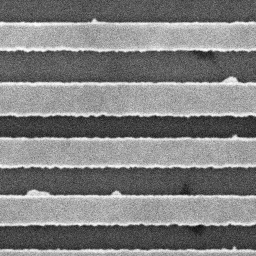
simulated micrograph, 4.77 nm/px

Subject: lines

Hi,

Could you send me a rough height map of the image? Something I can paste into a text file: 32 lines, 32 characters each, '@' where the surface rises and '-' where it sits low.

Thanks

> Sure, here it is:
--------------------------------
--------------------------------
--------------------------------
@@@@@@@@@@@@@@@@@@@@@@@@@@@@@@@@
@@@@@@@@@@@@@@@@@@@@@@@@@@@@@@@@
@@@@@@@@@@@@@@@@@@@@@@@@@@@@@@@@
--------------------------------
--------------------------------
--------------------------------
--------------------------------
@@@@@@@@@@@@@@@@@@@@@@@@@@@@@@@@
@@@@@@@@@@@@@@@@@@@@@@@@@@@@@@@@
@@@@@@@@@@@@@@@@@@@@@@@@@@@@@@@@
@@@@@@@@@@@@@@@@@@@@@@@@@@@@@@@@
--@--@----@---@---@---@@-----@@-
--------------------------------
--------------------------------
@@@@@@@@@@@@@@@@@@@@@@@@@@@@@@@@
@@@@@@@@@@@@@@@@@@@@@@@@@@@@@@@@
@@@@@@@@@@@@@@@@@@@@@@@@@@@@@@@@
@@@@@@@@@@@@@@@@@@@@@@@@@@@@@@@@
--------------------------------
--------------------------------
--------------------------------
@@@@@@@@@@@@@@@@@@@@@@@@@@@@@@@@
@@@@@@@@@@@@@@@@@@@@@@@@@@@@@@@@
@@@@@@@@@@@@@@@@@@@@@@@@@@@@@@@@
@@@@@@@@@@@@@@@@@@@@@@@@@@@@@@@@
--------------------------------
--------------------------------
--------------------------------
@@@@@@@@@@@@@@@@@@@@@@@@@@@@@@@@